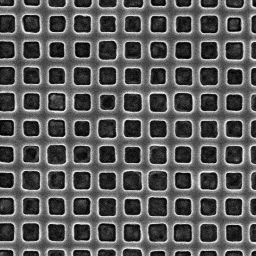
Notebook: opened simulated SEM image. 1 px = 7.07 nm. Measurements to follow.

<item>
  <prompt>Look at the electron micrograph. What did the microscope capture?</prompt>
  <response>a regular array of holes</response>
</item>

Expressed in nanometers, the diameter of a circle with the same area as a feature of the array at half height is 136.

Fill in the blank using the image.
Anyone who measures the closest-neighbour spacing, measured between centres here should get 178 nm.